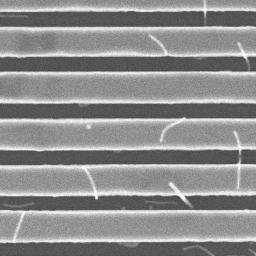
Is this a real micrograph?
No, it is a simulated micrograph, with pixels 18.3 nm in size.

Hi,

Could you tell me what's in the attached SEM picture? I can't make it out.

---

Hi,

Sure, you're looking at lines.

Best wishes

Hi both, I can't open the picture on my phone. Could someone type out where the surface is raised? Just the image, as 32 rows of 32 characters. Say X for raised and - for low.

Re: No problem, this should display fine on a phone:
XXXXXXXXXXXXXXXXXXXXXXXXXXXXXXXX
--------------------------------
--------------------------------
XXXXXXXXXXXXXXXXXXXXXXXXXXXXXXXX
XXXXXXXXXXXXXXXXXXXXXXXXXXXXXXXX
XXXXXXXXXXXXXXXXXXXXXXXXXXXXXXXX
XXXXXXXXXXXXXXXXXXXXXXXXXXXXXXXX
--------------------------------
--------------------------------
XXXXXXXXXXXXXXXXXXXXXXXXXXXXXXXX
XXXXXXXXXXXXXXXXXXXXXXXXXXXXXXXX
XXXXXXXXXXXXXXXXXXXXXXXXXXXXXXXX
XXXXXXXXXXXXXXXXXXXXXXXXXXXXXXXX
--------------------------------
--------------------------------
XXXXXXXXXXXXXXXXXXXXXXXXXXXXXXXX
XXXXXXXXXXXXXXXXXXXXXXXXXXXXXXXX
XXXXXXXXXXXXXXXXXXXXXXXXXXXXXXXX
XXXXXXXXXXXXXXXXXXXXXXXXXXXXXXXX
--------------------------------
-----------------------------XX-
XXXXXXXXXXXXXXXXXXXXXXXXXXXXXXXX
XXXXXXXXXXXXXXXXXXXXXXXXXXXXXXXX
XXXXXXXXXXXXXXXXXXXXXXXXXXXXXXXX
------X----X----------XX--------
--------------------------------
XXXXXXXXXXXXXXXXXXXXXXXXXXXXXXXX
XXXXXXXXXXXXXXXXXXXXXXXXXXXXXXXX
XXXXXXXXXXXXXXXXXXXXXXXXXXXXXXXX
XXXXXXXXXXXXXXXXXXXXXXXXXXXXXXXX
--------------------------------
--------------------------------